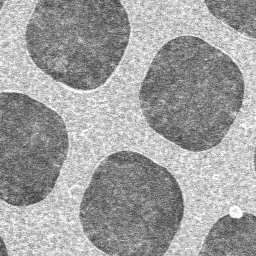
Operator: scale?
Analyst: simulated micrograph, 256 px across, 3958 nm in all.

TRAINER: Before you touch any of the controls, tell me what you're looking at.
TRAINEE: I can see holes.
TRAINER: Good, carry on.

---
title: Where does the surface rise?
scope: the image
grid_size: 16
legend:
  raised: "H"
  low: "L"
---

HHLLLLLLHHHHHLLL
HHLLLLLLHHHHHHLL
HHLLLLLLHHHLLHHH
HHLLLLLLHHLLLLHH
HHHLLLLHHLLLLLLH
HHHHLLHHHLLLLLLH
LLLHHHHHHLLLLLLH
LLLLHHHHHLLLLLLH
LLLLHHHHHHLLLLHH
LLLLHHHLHHHHHHHH
LLLLHHLLLLHHHHHH
LLLHHHLLLLLHHHHH
LLLHHLLLLLLHHHHH
HHHHHLLLLLLHHHHL
HHHHHLLLLLLHHLLL
HHHHHHLLLLLHHLLL